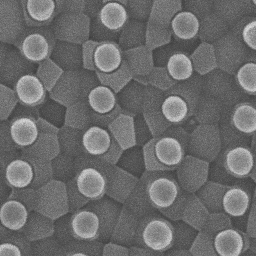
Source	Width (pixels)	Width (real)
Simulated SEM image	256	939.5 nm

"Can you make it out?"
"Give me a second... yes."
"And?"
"a regular array of raised bodies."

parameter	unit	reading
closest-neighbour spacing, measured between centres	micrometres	0.154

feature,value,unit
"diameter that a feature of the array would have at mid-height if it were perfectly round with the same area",94.7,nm